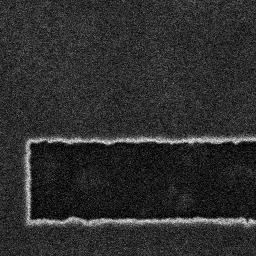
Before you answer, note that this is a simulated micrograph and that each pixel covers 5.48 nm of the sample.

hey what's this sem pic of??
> one or a few lines or trenches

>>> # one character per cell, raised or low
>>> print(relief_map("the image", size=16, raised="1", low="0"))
1111111111111111
1111111111111111
1111111111111111
1111111111111111
1111111111111111
1111111111111111
1111111111111111
1111111111111111
1111111111111111
1100000000000000
1100000000000000
1100000000000000
1100000000000000
1100000000000000
1111111111111111
1111111111111111